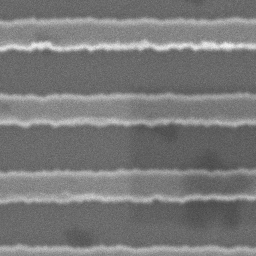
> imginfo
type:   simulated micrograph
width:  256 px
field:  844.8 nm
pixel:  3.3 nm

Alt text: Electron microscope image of lines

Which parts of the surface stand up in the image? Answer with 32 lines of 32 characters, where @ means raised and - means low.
--------------------------------
--------------------------------
--------@@@@------@----------@--
@@@@@@@@@@@@@@@@@@@@@@@@@@@@@@@@
@@@@@@@@@@@@@@@@@@@@@@@@@@@@@@@@
@@@@@@@@@@@@@@@@@@@@@@@@@@@@@@@@
--------------------------------
--------------------------------
--------------------------------
--------------------------------
--------------------------------
--------------------------------
@@@@@@@@@@@@@@@@@@@@@@@@@@@@@@@@
@@@@@@@@@@@@@@@@@@@@@@@@@@@@@@@@
@@@@@@@@@@@@@@@@@@@@@@@@@@@@@@@@
--@@--@@----@--@@-@@-----@@-@@--
--------------------------------
--------------------------------
--------------------------------
--------------------------------
--------------------------------
--------@-----@@@@@@@@@@@@---@@@
@@@@@@@@@@@@@@@@@@@@@@@@@@@@@@@@
@@@@@@@@@@@@@@@@@@@@@@@@@@@@@@@@
@@@@@@@@@@@@@@@@@@@@@@@@@@@@@@@@
--------------------------------
--------------------------------
--------------------------------
--------------------------------
--------------------------------
--------------------------------
@@@@@@@@@@@@@@@@@@@@@@@@@@@@@@@@